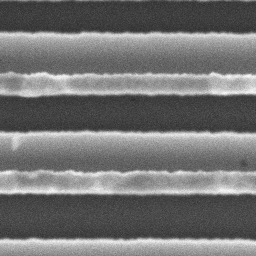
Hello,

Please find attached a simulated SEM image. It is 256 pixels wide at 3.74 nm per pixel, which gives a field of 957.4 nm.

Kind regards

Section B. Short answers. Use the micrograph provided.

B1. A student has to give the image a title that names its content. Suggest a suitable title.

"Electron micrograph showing lines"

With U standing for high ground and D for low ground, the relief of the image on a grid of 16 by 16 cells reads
DDDDDDDDDDDDDDDD
DDDDDDDDDDDDDDDD
UUUUUUUUUUUUUUUU
UUUUUUUUUUUUUUUU
UUUUUUUUUUUUUUUU
UUUUUUUUUUUUUUUU
DDDDDDDDDDDDDDDD
DDDDDDDDDDDDDDDD
UUUUUUUUUUUUUUUU
UUUUUUUUUUUUUUUU
UUUUUUUUUUUUUUUU
UUUUUUUUUUUUUUUU
DDDDDDDDDDDDDDDD
DDDDDDDDDDDDDDDD
DDDDDDDDDDDDDDDD
UUUUUUUUUUUUUUUU